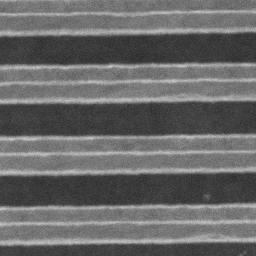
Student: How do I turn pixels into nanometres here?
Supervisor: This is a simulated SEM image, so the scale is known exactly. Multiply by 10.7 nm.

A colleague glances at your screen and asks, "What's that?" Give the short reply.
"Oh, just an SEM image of lines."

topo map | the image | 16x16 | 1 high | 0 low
1111111111111111
1111111111111111
0000000000000000
0000000000000000
1111111111111111
1111111111111111
0000000000000000
0000000000000000
0000000000000000
1111111111111111
1111111111111111
0000000000000000
0000000000000000
1111111111111111
1111111111111111
0000000000000000